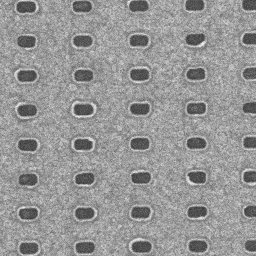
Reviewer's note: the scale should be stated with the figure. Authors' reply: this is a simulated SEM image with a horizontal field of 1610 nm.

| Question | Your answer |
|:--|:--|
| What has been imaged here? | a regular array of holes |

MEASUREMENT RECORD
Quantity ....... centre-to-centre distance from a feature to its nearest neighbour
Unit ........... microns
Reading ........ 0.213